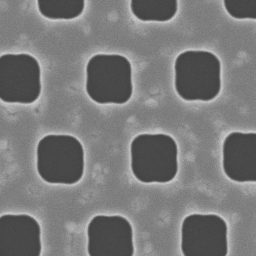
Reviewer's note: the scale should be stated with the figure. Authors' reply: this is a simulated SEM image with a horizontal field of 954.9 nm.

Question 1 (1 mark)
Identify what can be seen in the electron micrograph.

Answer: holes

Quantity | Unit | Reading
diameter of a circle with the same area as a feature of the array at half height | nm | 189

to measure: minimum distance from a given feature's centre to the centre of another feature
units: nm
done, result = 334